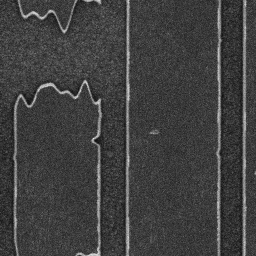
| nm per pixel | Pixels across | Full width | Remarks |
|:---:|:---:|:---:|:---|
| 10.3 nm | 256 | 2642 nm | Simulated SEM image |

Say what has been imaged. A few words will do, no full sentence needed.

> one or a few lines or trenches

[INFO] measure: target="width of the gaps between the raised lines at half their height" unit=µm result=0.259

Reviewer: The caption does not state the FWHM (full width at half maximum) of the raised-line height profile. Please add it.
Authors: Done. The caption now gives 951 nm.